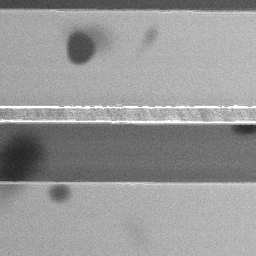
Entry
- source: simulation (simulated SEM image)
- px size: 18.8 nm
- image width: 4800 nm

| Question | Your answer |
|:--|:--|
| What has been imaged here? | lines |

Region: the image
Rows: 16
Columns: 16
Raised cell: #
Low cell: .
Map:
................
################
################
################
################
################
################
################
................
................
................
##########......
################
################
################
################